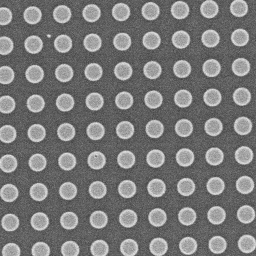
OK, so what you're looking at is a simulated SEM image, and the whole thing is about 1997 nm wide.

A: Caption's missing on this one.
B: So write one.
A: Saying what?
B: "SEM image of an array of small figures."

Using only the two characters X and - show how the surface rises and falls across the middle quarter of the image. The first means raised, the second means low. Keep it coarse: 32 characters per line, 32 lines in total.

X-----XXX----XXXX---XXXX----XXX-
XX---XXXX----XXXX---XXXX---XXXXX
XX---XXXX----XXXX---XXXX----XXX-
XX----XXX----XXX-----XX---------
--------------------------------
--------------------------------
--------------------------------
-------XX-----XX-----XXX----XXXX
XX----XXXX---XXXX---XXXX----XXXX
XX----XXXX---XXXX---XXXX----XXXX
XX----XXX----XXXX----XXX-----XX-
X-------------------------------
--------------------------------
--------------------------------
--------------XX-----XXX----XXX-
XX----XXXX---XXXX----XXXX---XXXX
XXX---XXXX---XXXX----XXXX---XXXX
XXX---XXXX---XXXX----XXXX----XXX
XX----XXX-----XX----------------
--------------------------------
--------------------------------
-----------------------------XX-
XX-----XXX----XXX----XXXX---XXXX
XXX---XXXX---XXXXX---XXXX---XXXX
XXX---XXXX---XXXXX---XXXX---XXXX
XXX---XXXX----XXX-----XX--------
--------------------------------
--------------------------------
--------------------------------
--------X------XX-----XXX----XXX
XXX----XXX----XXXX---XXXX---XXXX
XXX---XXXX----XXXX---XXXX----XXX